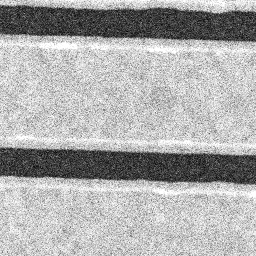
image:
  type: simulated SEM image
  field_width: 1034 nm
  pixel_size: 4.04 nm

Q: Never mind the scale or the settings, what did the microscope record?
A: one or a few lines or trenches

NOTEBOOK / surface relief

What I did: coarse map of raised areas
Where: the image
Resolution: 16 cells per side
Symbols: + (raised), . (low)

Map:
................
................
................
++++++++++++++++
++++++++++++++++
++++++++++++++++
++++++++++++++++
++++++++++++++++
++++++++++++++++
................
................
++++............
++++++++++++++++
++++++++++++++++
++++++++++++++++
++++++++++++++++